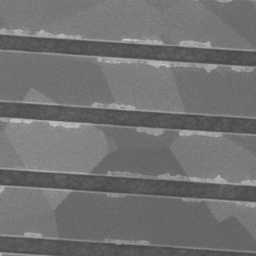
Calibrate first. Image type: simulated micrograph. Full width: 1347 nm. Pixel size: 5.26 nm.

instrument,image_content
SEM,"one or a few lines or trenches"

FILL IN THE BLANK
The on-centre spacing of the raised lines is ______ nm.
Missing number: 354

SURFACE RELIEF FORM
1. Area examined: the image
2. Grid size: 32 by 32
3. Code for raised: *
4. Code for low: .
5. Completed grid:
********************************
********************************
********************************
********************************
....****************************
...................*************
****............................
*****************...............
********************************
********************************
********************************
********************************
********************************
.............*******************
............................****
***********.....................
**************************......
********************************
********************************
********************************
********************************
.......*************************
......................**********
***.............................
******************..............
********************************
********************************
********************************
********************************
.*******************************
...............*****************
...............................*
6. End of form